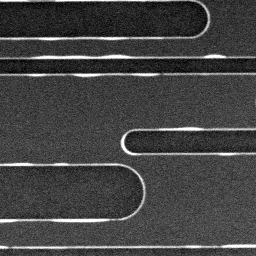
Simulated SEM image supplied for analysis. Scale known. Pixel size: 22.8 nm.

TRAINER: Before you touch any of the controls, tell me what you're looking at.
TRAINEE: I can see groups of lines, slits or small figures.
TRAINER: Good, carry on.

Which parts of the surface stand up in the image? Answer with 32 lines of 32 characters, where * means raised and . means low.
.........................*******
..........................******
..........................******
..........................******
.........................*******
********************************
********************************
................................
................................
********************************
********************************
********************************
********************************
********************************
********************************
********************************
****************................
***************.................
****************................
********************************
********************************
.................***************
..................**************
..................**************
..................**************
..................**************
.................***************
...............*****************
********************************
********************************
********************************
................................